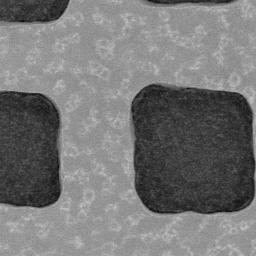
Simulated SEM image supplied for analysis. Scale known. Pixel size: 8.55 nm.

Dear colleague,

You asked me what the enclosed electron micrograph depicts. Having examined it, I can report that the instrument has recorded holes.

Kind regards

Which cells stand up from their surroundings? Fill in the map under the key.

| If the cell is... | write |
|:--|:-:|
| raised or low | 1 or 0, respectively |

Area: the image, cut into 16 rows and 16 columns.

0000111111111111
0111111111111111
1111111111111111
1111111111111111
1111111111111111
1111111110001111
0001111100000000
0000111100000000
0000111100000000
0000111100000000
0000111100000000
0000111100000000
0000111110000000
1111111111111111
1111111111111111
1111111111111111